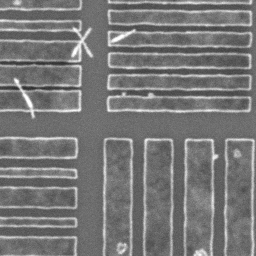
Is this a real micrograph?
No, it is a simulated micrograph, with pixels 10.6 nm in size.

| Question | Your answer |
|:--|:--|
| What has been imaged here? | groups of lines, slits or small figures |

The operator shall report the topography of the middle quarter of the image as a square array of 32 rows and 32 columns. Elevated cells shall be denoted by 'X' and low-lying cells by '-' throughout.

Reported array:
-----------XXXXXXXXXXXXXXXXXXXXX
XXXX----------------------------
XXXX----------------------------
XXXX-------XXXXXXXXXXXXXXXXXXXXX
XXXX-------XXXXXXXXXXXXXXXXXXXXX
--XX-------XXXXXXXXXXXXXXXXXXXXX
------------------------------XX
XXXX----------------------------
XXXX-------XXXXXXXXXXXXXXXXXXXXX
XXXX-------XXXXXXXXXXXXXXXXXXXXX
XXXX-------XXXXXXXXXXXXXXXXXXXXX
XXXX-------XXXX-XXXXXXXXXXXXXXXX
--------------------------------
--------------------------------
--------------------------------
--------------------------------
--------------------------------
--------------------------------
--------------------------------
XXX-------XXXXXXX----XXXXXX---XX
XXX-------XXXXXXX---XXXXXXX---XX
XXX-------XXXXXXX---XXXXXXX---XX
XXX-------XXXXXXX---XXXXXXX---XX
----------XXXXXXX---XXXXXXX---XX
----------XXXXXXX---XXXXXXX---XX
----------XXXXXXX---XXXXXXX---XX
XXX-------XXXXXXX---XXXXXXX---XX
XXX-------XXXXXXX---XXXXXXX---XX
--X-------XXXXXXX---XXXXXXX---XX
----------XXXXXXX---XXXXXXX---XX
----------XXXXXXX---XXXXXXX---XX
XXX-------XXXXXXX---XXXXXXX---XX